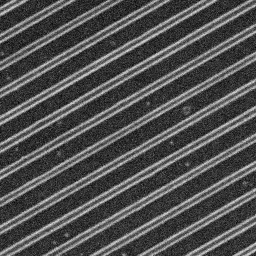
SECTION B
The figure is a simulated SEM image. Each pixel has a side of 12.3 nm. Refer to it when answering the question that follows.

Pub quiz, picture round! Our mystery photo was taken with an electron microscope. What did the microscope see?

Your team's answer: parallel lines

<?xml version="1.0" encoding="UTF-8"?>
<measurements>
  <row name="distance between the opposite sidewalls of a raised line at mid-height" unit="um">0.0825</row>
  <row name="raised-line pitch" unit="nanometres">291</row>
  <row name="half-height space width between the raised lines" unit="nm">214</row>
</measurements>